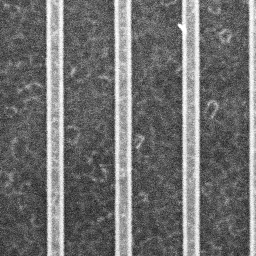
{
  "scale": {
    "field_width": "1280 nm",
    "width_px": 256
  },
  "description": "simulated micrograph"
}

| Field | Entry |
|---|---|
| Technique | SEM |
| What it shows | one or a few lines or trenches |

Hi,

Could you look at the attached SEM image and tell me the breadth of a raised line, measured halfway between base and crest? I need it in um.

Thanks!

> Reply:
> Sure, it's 0.0651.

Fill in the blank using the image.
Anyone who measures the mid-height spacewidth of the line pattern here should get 0.274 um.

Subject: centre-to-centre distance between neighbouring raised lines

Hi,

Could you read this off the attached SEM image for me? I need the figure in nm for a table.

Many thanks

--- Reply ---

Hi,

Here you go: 339